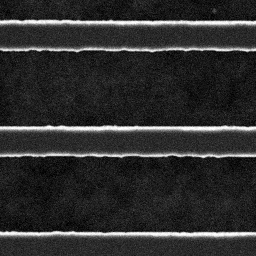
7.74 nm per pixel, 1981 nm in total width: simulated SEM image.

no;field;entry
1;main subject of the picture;lines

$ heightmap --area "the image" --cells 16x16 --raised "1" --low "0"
0000000000000000
1111111111111111
1111111111111111
0000000000000000
0000000000000000
0000000000000000
0000000000000000
0000000000000000
1111111111111111
1111111111111111
0000000000000000
0000000000000000
0000000000000000
0000000000000000
0000000000000000
1111111111111111